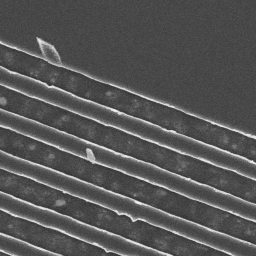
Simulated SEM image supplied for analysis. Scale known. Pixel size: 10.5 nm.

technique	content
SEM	parallel lines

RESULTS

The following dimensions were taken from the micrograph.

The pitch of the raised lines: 411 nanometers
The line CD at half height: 178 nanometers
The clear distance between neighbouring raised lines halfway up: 229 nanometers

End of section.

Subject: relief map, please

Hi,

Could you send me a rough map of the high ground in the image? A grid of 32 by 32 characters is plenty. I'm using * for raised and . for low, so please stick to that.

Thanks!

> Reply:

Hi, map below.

********************************
********************************
********************************
********************************
********************************
********************************
...*****************************
......**************************
*.......************************
***........*********************
******.......*******************
..******........****************
.....******........*************
........******........**********
***.......******........********
*****........******........*****
..******........******........**
.....*****........******........
.......******........******.....
**........******........******..
*****.......*******.......******
.******........******........***
....******........******........
.......******........******.....
**.......******........******...
****........******........******
.******.......*******.......****
....******.......******........*
......******........******......
*........******........******...
****.......*******.......*******
*******.......******........****